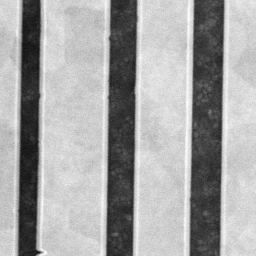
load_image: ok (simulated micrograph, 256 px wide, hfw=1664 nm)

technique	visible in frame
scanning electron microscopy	one or a few lines or trenches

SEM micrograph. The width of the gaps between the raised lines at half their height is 211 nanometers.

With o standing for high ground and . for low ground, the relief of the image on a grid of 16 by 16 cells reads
o..oooo..ooo..oo
o..oooo..ooo..oo
o..oooo..ooo..oo
o..oooo..ooo..oo
o..oooo..ooo..oo
o..oooo..ooo..oo
o..oooo..ooo..oo
o..oooo..ooo..oo
o..oooo..ooo..oo
o..oooo..ooo..oo
o..oooo..ooo..oo
o..oooo..ooo..oo
o..ooo...ooo..oo
o..ooo...ooo..oo
o..ooo...ooo..oo
o..ooo...ooo..oo